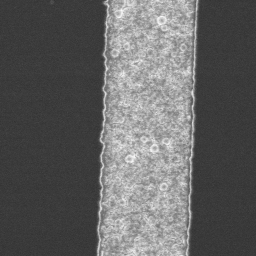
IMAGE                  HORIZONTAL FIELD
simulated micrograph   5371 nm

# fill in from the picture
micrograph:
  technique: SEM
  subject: one or a few lines or trenches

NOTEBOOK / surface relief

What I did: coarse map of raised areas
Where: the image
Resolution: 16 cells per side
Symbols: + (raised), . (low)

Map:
+++++++.....++++
+++++++.....++++
+++++++.....++++
+++++++.....++++
+++++++.....++++
+++++++.....++++
+++++++.....++++
+++++++.....++++
++++++......++++
++++++......++++
++++++......++++
++++++......++++
++++++......++++
++++++......++++
++++++......++++
++++++......++++